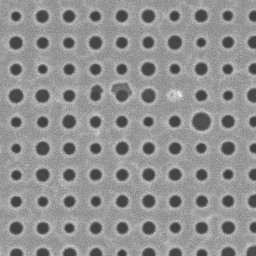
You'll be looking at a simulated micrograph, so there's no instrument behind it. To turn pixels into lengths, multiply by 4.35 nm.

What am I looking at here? a regular array of holes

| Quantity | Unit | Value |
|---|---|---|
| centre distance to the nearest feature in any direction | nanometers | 114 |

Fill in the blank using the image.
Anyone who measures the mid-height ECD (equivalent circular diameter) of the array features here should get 52.8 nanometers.